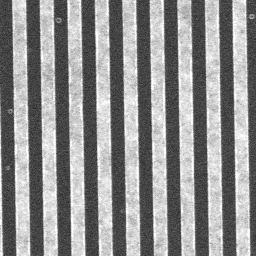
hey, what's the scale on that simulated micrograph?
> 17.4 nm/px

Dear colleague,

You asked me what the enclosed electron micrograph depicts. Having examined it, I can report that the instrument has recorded parallel lines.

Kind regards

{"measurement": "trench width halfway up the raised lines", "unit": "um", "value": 0.248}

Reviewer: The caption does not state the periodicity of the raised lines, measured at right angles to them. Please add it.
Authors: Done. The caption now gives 480 nm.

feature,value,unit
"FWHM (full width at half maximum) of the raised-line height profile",13.2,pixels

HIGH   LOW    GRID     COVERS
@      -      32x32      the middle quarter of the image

-@@@----@@@----@@@----@@@----@@@
-@@@----@@@----@@@----@@@----@@@
-@@@----@@@----@@@----@@@----@@@
-@@@----@@@----@@@----@@@----@@@
-@@@----@@@----@@@----@@@----@@@
-@@@----@@@----@@@----@@@----@@@
-@@@----@@@----@@@----@@@----@@@
-@@@----@@@----@@@----@@@----@@@
-@@@----@@@----@@@----@@@----@@@
-@@@----@@@----@@@----@@@----@@@
--@@----@@@----@@@----@@@----@@@
--@@----@@@----@@@----@@@----@@@
--@@@---@@@----@@@----@@@----@@@
--@@@---@@@----@@@----@@@----@@@
--@@@---@@@----@@@----@@@----@@@
--@@@---@@@----@@@----@@@----@@@
--@@@----@@----@@@----@@@----@@@
--@@@----@@----@@@----@@@----@@@
--@@@----@@@---@@@----@@@----@@@
--@@@---@@@@---@@@----@@@----@@@
--@@@---@@@@---@@@----@@@----@@@
--@@@----@@@---@@@----@@@----@@@
--@@@----@@@---@@@----@@@----@@@
--@@@----@@@---@@@----@@@----@@@
--@@@----@@@---@@@----@@@----@@@
--@@@----@@@---@@@@---@@@----@@@
--@@@----@@@---@@@----@@@----@@@
--@@@----@@@---@@@----@@@----@@@
--@@@----@@@---@@@----@@@----@@@
--@@@----@@@---@@@----@@@----@@@
--@@@----@@@----@@----@@@----@@@
--@@@----@@@----@@@---@@@----@@@